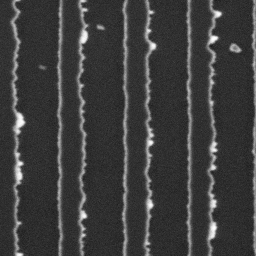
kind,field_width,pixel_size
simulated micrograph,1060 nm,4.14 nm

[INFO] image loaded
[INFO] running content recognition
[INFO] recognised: lines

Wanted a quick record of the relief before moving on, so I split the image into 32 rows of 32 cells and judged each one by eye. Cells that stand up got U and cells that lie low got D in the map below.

UUDDDDDDUUDDDDDDUUUDDDDDUUUDDDDD
UUDDDDDUUUDDDDDDUUUDDDDUUUUDDDDD
UUDDDDDUUUDDDDDDUUUDDDDUUUUDDDDD
UUDDDDDUUUUDDDDDUUUDDDDDUUUDDDDD
UUDDDDDUUUUDDDDDUUDDDDDDUUUDDDDD
UUDDDDDUUUDDDDDDUUUDDDDDUUDDDDDD
UUDDDDDUUUDDDDDDUUUDDDDDUUUDDDDD
UUDDDDDUUUDDDDDDUUDDDDDUUUUDDDDD
UUDDDDDUUUDDDDDDUUUDDDDUUUUDDDDD
UUDDDDDUUUDDDDDDUUUDDDDDUUUDDDDD
UUDDDDDUUUDDDDDDUUUDDDDUUUUDDDDD
UUDDDDDUUUDDDDDDUUUDDDDDUUDDDDDD
UUDDDDDUUUDDDDDDUUUDDDDDUUDDDDDD
UUDDDDDUUUDDDDDDUUDDDDDDUUUDDDDD
UUUDDDDUUUDDDDDDUUUDDDDDUUUDDDDD
UUUDDDDUUUDDDDDDUUUDDDDDUUUDDDDD
UUDDDDDUUUUDDDDDUUUDDDDDUUUDDDDD
UUDDDDDUUUUDDDDDUUUDDDDDUUUDDDDD
UUDDDDDUUUUDDDDDUUUDDDDDUUUDDDDD
UUDDDDDUUUUDDDDDUUUDDDDDUUUDDDDD
UUDDDDDUUUUDDDDDUUUDDDDDUUUDDDDD
UUUDDDDUUUDDDDDDUUDDDDDDUUDDDDDD
UUDDDDDUUUDDDDDDUUUDDDDDUUUDDDDD
UUDDDDDUUUDDDDDDUUUDDDDDUUUDDDDD
UUDDDDDUUUUDDDDDUUUDDDDDUUDDDDDD
UUDDDDDUUUDDDDDDUUUDDDDDUUUDDDDD
UUDDDDDUUUDDDDDUUUUDDDDDUUUDDDDD
UUDDDDDUUUDDDDDUUUUDDDDUUUUDDDDD
UUDDDDDUUUDDDDDDUUUDDDDDUUUDDDDD
UUDDDDDDUUDDDDDDUUDDDDDDUUUDDDDD
UUDDDDDUUUDDDDDDUUDDDDDDUUDDDDDD
UUDDDDDUUUDDDDDDUUUDDDDDUUDDDDDD